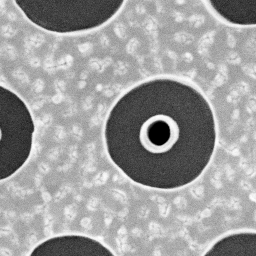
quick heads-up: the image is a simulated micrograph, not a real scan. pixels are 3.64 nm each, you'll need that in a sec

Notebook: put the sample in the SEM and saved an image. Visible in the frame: ring-shaped grooves with a dot in the middle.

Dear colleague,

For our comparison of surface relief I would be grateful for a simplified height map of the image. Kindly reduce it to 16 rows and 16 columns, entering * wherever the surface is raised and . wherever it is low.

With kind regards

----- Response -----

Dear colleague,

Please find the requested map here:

*......******...
**....*********.
****************
****************
****************
********....****
..*****......***
..*****......***
..*****......***
..*****......***
.******......***
*********...****
****************
****************
***************.
**.....******...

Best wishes